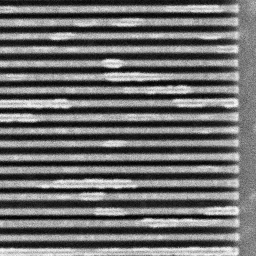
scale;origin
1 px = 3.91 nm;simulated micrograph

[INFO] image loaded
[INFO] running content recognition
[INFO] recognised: parallel lines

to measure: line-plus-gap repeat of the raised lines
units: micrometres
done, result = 0.0525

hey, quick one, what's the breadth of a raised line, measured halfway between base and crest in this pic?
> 26.4 nanometres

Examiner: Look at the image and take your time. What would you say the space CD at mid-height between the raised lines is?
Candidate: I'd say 26.4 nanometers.